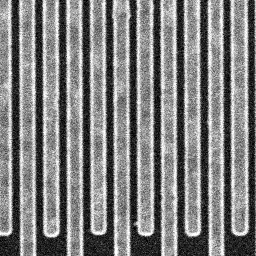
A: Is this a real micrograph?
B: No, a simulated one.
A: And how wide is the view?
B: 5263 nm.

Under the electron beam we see parallel lines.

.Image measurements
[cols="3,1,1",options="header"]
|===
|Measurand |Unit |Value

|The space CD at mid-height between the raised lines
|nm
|211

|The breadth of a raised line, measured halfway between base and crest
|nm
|262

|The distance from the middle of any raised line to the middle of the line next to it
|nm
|484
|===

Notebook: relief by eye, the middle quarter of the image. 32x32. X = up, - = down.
-XXX---XXX---XXX---XXX---XXX---X
-XXX---XXX---XXX---XXX---XXX---X
-XXX---XXX---XXX---XXX---XXX---X
-XXX---XXX---XXX---XXX---XXX---X
-XXX---XXX---XXX---XXX---XXX---X
-XXX---XXX---XXX---XXX---XXX---X
-XXX---XXX---XXX---XXX---XXX---X
-XXX---XXX---XXX---XXX---XXX---X
-XXX---XXX---XXX---XXX---XXX---X
-XXX---XXX---XXX---XXX---XXX---X
-XXX---XXX---XXX---XXX---XXX---X
-XXX---XXX---XXX---XXX---XXX---X
-XXX---XXX---XXX---XXX---XXX---X
-XXX---XXX---XXX---XXX---XXX---X
-XXX---XXX---XXX---XXX---XXX---X
-XXX---XXX---XXX---XXX---XXX---X
-XXX---XXX---XXX---XXX---XXX---X
-XXX---XXX---XXX---XXX---XXX---X
-XXX---XXX---XXX---XXX---XXX---X
-XXX---XXX---XXX---XXX---XXX---X
-XXX---XXX---XXX---XXX---XXX---X
-XXX---XXX---XXX---XXX---XXX---X
-XXX---XXX---XXX---XXX---XXX---X
-XXX---XXX---XXX---XXX---XXX---X
-XXX---XXX---XXX---XXX---XXX---X
-XXX---XXX---XXX---XXX---XXX---X
-XXX---XXX---XXX---XXX---XXX---X
-XXX---XXX---XXX---XXX---XXX---X
-XXX---XXX---XXX---XXX---XXX---X
-XXX---XXX---XXX---XXX---XXX---X
-XXX---XXX---XXX---XXX---XXX---X
-XXX---XXX---XXX---XXX---XXX---X